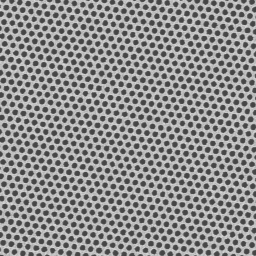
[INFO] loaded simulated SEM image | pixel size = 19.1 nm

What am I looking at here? a regular array of holes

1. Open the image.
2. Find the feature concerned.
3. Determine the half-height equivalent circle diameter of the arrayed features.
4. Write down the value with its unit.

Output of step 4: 114 nm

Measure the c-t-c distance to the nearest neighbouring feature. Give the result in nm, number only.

154